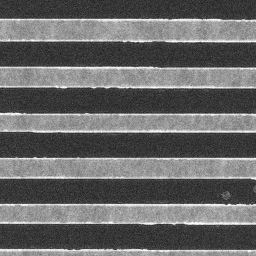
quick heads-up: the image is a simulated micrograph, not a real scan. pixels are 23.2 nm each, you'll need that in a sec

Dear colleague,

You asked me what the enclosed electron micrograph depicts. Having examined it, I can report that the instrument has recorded lines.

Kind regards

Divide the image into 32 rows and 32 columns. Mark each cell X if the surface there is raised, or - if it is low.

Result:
--------------------------------
--------------------------------
XXXXXXXXXXXXXXXXXXXXXXXXX-XX----
XXXXXXXXXXXXXXXXXXXXXXXXXXXXXXXX
XXXXXXXXXXXXXXXXXXXXXXXXXXXXXXXX
--------------------------------
--------------------------------
--------------------------------
XXXXXXXXXXXXXXXXXXX-------------
XXXXXXXXXXXXXXXXXXXXXXXXXXXXXXXX
XXXXXXXXXXXXXXXXXXXXXXXXXXXXXXXX
--------------------------------
--------------------------------
--------------------------------
XXXXXXXXXXXXXXXXXXXXXXXXXXXXXXXX
XXXXXXXXXXXXXXXXXXXXXXXXXXXXXXXX
--------------------------------
--------------------------------
--------------------------------
--------------------------------
XXXXXXXXXXXXXXXXXXXXXXXXXXXXXXXX
XXXXXXXXXXXXXXXXXXXXXXXXXXXXXXXX
--------------------------------
--------------------------------
--------------------------------
--------------------------------
XXXXXXXXXXXXXXXXXXXXXXXXXXXXXXXX
XXXXXXXXXXXXXXXXXXXXXXXXXXXXXXXX
--------------------------------
--------------------------------
--------------------------------
XXXXXXXXXXXXXXXXXXXXXXXXXXXXXXXX